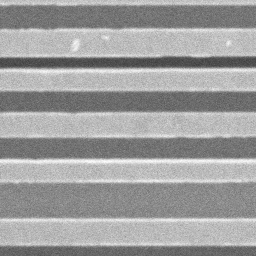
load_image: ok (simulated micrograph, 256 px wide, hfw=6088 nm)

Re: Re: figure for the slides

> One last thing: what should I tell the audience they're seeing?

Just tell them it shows lines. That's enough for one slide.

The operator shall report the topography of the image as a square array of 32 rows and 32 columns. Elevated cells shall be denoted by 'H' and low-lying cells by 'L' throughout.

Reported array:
HHHHHHHHHHHHHHHHHHHHHHHHHHHHHHHH
LLLLLLLLLLLLLLLLLLLLLLLLLLLLLLLL
LLLLLLLLLLLLLLLLLLLLLLLLLLLLLLLL
LLLLLLLLLLLLLLLLLLLLLLLLLLLLLLLL
HHHHHHHHHHHHHHHHHHHHHHHHHHHHHHHH
HHHHHHHHHHHHHHHHHHHHHHHHHHHHHHHH
HHHHHHHHHHHHHHHHHHHHHHHHHHHHHHHH
LLLLLLLLLLLLLLLLLLLLLLLLLLLLLLLL
LLLLLLLLLLLLLLLLLLLLLLLLLLLLLLLL
HHHHHHHHHHHHHHHHHHHHHHHHHHHHHHHH
HHHHHHHHHHHHHHHHHHHHHHHHHHHHHHHH
LLLLLLLLLLLLLLLLLLLLLLLLLLLLLLLL
LLLLLLLLLLLLLLLLLLLLLLLLLLLLLLLL
LLLLLLLLLLLLLLLLLLLLLLLLLLLLLLLL
HHHHHHHHHHHHHHHHHHHHHHHHHHHHHHHH
HHHHHHHHHHHHHHHHHHHHHHHHHHHHHHHH
HHHHHHHHHHHHHHHHHHHHHHHHHHHHHHHH
LLLLLLLLLLLLLLLLLLLLLLLLLLLLLLLL
LLLLLLLLLLLLLLLLLLLLLLLLLLLLLLLL
LLLLLLLLLLLLLLLLLLLLLLLLLLLLLLLL
HHHHHHHHHHHHHHHHHHHHHHHHHHHHHHHH
HHHHHHHHHHHHHHHHHHHHHHHHHHHHHHHH
HHHHHHHHHHHHHHHHHHHHHHHHHHHHHHHH
LLLLLLLLLLLLLLLLLLLLLLLLLLLLLLLL
LLLLLLLLLLLLLLLLLLLLLLLLLLLLLLLL
LLLLLLLLLLLLLLLLLLLLLLLLLLLLLLLL
LLLLLLLLLLLLLLLLLLLLLLLLLLLLLLLL
HHHHHHHHHHHHHHHHHHHHHHHHHHHHHHHH
HHHHHHHHHHHHHHHHHHHHHHHHHHHHHHHH
HHHHHHHHHHHHHHHHHHHHHHHHHHHHHHHH
HHHHHHHHHHHHHHHHHHHHHHHHHHHHHHHH
LLLLLLLLLLLLLLLLLLLLLLLLLLLLLLLL